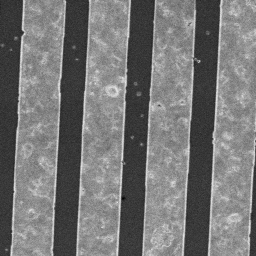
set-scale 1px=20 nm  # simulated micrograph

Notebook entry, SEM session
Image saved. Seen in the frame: one or a few lines or trenches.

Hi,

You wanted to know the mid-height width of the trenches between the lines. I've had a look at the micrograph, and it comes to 25.5 pixels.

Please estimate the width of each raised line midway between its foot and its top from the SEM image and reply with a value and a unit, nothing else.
791 nanometres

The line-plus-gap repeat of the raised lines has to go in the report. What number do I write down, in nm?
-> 1310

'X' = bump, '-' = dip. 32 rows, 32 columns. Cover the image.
---XXXXX---XXXXX----XXXX----XXXX
---XXXXX---XXXXX---XXXXX----XXXX
---XXXXX---XXXXX---XXXXX----XXXX
---XXXXX---XXXXX---XXXXX----XXXX
---XXXXX---XXXXX---XXXXX----XXXX
---XXXXX---XXXXX---XXXXX---XXXXX
---XXXXX---XXXXX---XXXXX---XXXXX
---XXXXX---XXXXX---XXXXX---XXXXX
---XXXXX---XXXXX---XXXXX---XXXXX
---XXXXX---XXXXX---XXXXX---XXXXX
---XXXX----XXXXX---XXXXX---XXXXX
--XXXXX----XXXXX---XXXXX---XXXXX
--XXXXX----XXXXX---XXXXX---XXXXX
--XXXXX----XXXXX---XXXXX---XXXXX
--XXXXX----XXXX----XXXXX---XXXXX
--XXXXX---XXXXX----XXXXX---XXXXX
--XXXXX---XXXXX----XXXXX---XXXXX
--XXXXX---XXXXX----XXXXX---XXXXX
--XXXXX---XXXXX---XXXXXX---XXXXX
--XXXXX---XXXXX---XXXXXX---XXXXX
--XXXXX---XXXXX---XXXXX----XXXXX
--XXXXX---XXXXX---XXXXX----XXXXX
--XXXXX---XXXXX---XXXXX----XXXX-
--XXXXX---XXXXX---XXXXX----XXXX-
--XXXXX---XXXXX---XXXXX----XXXX-
--XXXXX---XXXXX---XXXXX---XXXXX-
--XXXXX---XXXXX---XXXXX---XXXXX-
--XXXXX---XXXXX---XXXXX---XXXXX-
--XXXXX---XXXXX---XXXXX---XXXXX-
--XXXXX---XXXXX---XXXXX---XXXXX-
--XXXX----XXXXX---XXXXX---XXXXX-
-XXXXX----XXXXX---XXXXX---XXXXX-